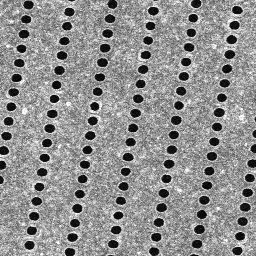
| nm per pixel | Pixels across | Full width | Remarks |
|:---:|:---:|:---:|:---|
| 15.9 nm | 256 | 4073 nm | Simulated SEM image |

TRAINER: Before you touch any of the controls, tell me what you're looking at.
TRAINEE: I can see a regular array of holes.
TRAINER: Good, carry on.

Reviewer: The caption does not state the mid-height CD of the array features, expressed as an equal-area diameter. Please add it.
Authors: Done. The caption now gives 9.57 pixels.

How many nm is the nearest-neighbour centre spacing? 232